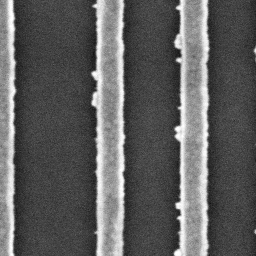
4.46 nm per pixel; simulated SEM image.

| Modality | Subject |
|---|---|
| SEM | lines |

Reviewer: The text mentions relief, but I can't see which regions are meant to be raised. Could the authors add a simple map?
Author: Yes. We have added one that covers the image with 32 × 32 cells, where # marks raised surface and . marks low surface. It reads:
#...........###........###......
#...........###........###......
##..........###........###......
##..........###........###......
#...........###........###......
#...........###.......####......
##..........###........###......
##..........###........###......
##..........###........###......
##..........###........###......
##..........###........###......
##..........###........###......
##..........###........###......
##..........###........###......
##..........###........###......
##..........###........###......
##..........###.......####......
##..........###........###......
##..........###........###......
#...........###........###......
#...........###........###......
##..........###........###......
#...........###........###......
#...........###........###......
#...........###........###......
#...........###........###......
#...........###........###......
##..........###........###......
##..........###........###......
##..........###........###......
#...........###........###......
#...........###.......####......